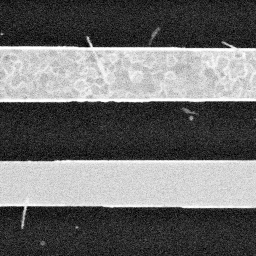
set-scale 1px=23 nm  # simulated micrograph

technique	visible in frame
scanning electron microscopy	lines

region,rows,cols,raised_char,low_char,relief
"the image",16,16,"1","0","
0000000000000000
0000000000000000
0000000000000000
1111111111111111
1111111111111111
1111111111111111
0000000000000000
0000000000000000
0000000000000000
0000000000000000
1111111111111111
1111111111111111
1111111111111111
0000000000000000
0000000000000000
0000000000000000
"